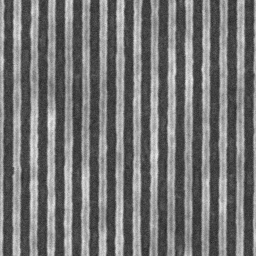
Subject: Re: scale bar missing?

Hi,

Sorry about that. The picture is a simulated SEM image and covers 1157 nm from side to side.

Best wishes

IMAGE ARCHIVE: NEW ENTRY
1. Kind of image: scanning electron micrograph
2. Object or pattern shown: parallel lines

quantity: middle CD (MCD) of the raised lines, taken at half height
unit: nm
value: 32.2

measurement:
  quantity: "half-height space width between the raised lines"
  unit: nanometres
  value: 44.7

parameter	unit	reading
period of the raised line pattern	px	17.2